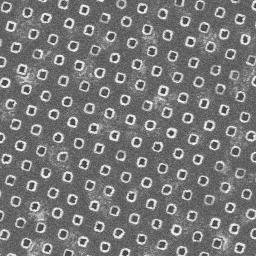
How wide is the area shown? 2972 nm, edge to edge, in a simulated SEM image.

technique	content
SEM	a regular array of holes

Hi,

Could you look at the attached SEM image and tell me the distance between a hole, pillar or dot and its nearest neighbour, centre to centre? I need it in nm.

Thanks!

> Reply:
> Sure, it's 236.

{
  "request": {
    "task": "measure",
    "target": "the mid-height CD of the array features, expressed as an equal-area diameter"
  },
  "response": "85.9 nm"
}